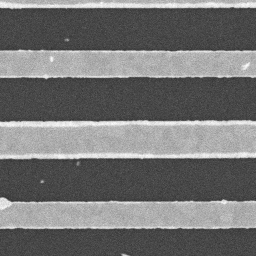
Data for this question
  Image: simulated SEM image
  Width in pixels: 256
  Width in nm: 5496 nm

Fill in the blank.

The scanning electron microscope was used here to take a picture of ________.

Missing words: lines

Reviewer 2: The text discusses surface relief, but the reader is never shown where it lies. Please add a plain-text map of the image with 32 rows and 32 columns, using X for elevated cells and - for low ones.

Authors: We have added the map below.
XXXXXXXXXXXXXXXXXXXXXXXXXXXXXXXX
--------------------------------
--------------------------------
--------------------------------
--------------------------------
--------------------------------
XXXXXXXXXXXXXXXXXXXXX-XXXXXXXXXX
XXXXXXXXXXXXXXXXXXXXXXXXXXXXXXXX
XXXXXXXXXXXXXXXXXXXXXXXXXXXXXXXX
XXXXXXXXXXXXXXXXXXXXXXXXXXXXXXXX
--------------------------------
--------------------------------
--------------------------------
--------------------------------
--------------------------------
XXXXXXXXXXXXXXXXXXXXXXXXXXXXXXXX
XXXXXXXXXXXXXXXXXXXXXXXXXXXXXXXX
XXXXXXXXXXXXXXXXXXXXXXXXXXXXXXXX
XXXXXXXXXXXXXXXXXXXXXXXXXXXXXXXX
XXXXXXXXXX-------XXXXXX---------
--------------------------------
--------------------------------
--------------------------------
--------------------------------
--------------------------------
XXXXXXXXXXXXXXXXXXXXXXXXXXXXXXXX
XXXXXXXXXXXXXXXXXXXXXXXXXXXXXXXX
XXXXXXXXXXXXXXXXXXXXXXXXXXXXXXXX
XXXXXXXXXXXXXXXX-XXXXXXXXXXXX-X-
--------------------------------
--------------------------------
--------------------------------